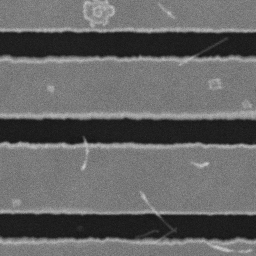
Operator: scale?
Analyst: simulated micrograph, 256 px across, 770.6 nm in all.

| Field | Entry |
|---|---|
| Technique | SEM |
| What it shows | lines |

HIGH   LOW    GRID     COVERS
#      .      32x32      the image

################################
################################
################################
################################
................................
................................
................................
################################
################################
################################
################################
################################
################################
################################
################################
................................
................................
................................
################################
################################
################################
################################
################################
################################
################################
################################
################################
................................
................................
................................
################################
################################